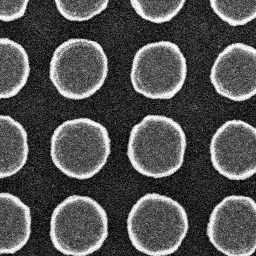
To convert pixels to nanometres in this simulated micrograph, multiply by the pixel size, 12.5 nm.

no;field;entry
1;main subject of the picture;raised bodies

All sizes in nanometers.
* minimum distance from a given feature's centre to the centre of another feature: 967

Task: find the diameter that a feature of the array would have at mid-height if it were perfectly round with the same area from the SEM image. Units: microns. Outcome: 0.711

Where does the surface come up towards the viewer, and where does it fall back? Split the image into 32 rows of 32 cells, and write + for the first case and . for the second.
+++....++++++....++++++....+++++
+++.....++++.....+++++.....+++++
...................++.......+++.
................................
................................
++......++++........+...........
+++....++++++....+++++......++++
+++....++++++....++++++....+++++
+++...+++++++....++++++....+++++
+++...+++++++....++++++....+++++
+++....++++++....++++++....+++++
++......+++......+++++......++++
................................
................................
................................
++......++++.....+++++......+++.
+++....++++++....++++++....+++++
+++....++++++...+++++++....+++++
+++....++++++...+++++++....+++++
+++....++++++...+++++++....+++++
+++....++++++....++++++....+++++
++......++++......++++......++++
................................
................................
+...............................
+++.....++++.....+++++......++++
++++...++++++....++++++....+++++
++++...++++++...+++++++...++++++
++++..+++++++...+++++++...++++++
++++...++++++...+++++++...++++++
+++....+++++.....+++++.....+++++
........+++.......+++.......++++